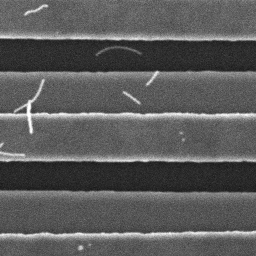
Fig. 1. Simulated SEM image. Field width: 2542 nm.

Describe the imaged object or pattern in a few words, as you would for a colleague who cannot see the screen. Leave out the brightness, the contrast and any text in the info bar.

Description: lines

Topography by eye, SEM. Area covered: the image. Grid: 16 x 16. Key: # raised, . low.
################
################
..............#.
................
.........#..##..
################
################
################
################
################
................
................
################
################
################
################